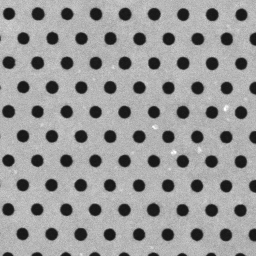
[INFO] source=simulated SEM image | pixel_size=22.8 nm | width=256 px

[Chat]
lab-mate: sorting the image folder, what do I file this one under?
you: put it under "a regular array of holes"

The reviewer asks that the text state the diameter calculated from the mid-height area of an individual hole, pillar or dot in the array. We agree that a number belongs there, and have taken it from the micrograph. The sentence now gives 0.289 microns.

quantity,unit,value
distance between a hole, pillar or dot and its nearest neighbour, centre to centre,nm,643